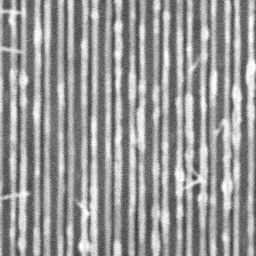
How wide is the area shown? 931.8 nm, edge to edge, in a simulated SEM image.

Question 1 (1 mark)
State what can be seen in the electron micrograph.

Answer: parallel lines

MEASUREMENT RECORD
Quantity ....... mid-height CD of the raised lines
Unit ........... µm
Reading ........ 0.0182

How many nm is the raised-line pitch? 43.2